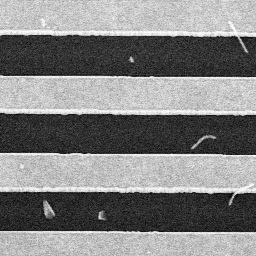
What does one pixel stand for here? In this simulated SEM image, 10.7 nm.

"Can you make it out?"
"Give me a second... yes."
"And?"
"lines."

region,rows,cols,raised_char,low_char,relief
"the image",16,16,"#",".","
################
################
................
................
................
################
################
................
................
................
################
################
................
................
##########......
################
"